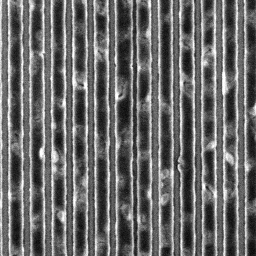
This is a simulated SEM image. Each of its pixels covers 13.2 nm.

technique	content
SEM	parallel lines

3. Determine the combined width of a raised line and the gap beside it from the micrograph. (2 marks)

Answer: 21.5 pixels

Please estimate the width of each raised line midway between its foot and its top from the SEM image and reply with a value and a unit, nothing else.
182 nm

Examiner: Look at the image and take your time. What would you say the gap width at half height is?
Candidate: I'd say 92.1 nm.